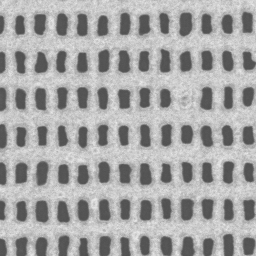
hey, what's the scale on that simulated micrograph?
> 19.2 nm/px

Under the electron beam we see a regular array of holes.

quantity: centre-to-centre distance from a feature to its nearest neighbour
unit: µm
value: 0.392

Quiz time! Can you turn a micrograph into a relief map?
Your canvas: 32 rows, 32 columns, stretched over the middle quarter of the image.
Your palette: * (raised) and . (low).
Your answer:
***...***..***...**..***..***...
****..***..***...**..***..***..*
********************************
********************************
********************************
********************************
.**...***..***..***...***.******
.**...**...**....**...**...*****
.**...**...***...**...**...*****
.**...***..***...**...**...*****
****..***..***...**..***..******
********************************
********************************
********************************
********************************
*********..***..***..****..***..
****..**...**...***...**...**...
.***..**...***..***...**...**...
.***..**...***..***...**...**...
.***..**...***..***...**...***..
****..*************..****.******
********************************
********************************
********************************
*********..*********************
.***..***..**...***..***...**...
.**...***...**...**...**...**...
.**...***..***...**...**...***..
.**...***..***..***...**...***..
.***..***..***..***...**..****..
********************************
********************************